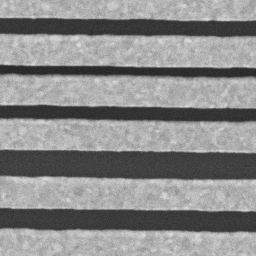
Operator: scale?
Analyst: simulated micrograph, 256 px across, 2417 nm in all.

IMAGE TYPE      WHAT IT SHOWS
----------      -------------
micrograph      lines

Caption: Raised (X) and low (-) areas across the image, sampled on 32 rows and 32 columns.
XXXXXXXXXXXXXXXXXXXXXXXXXXXXXXXX
XXXXXXXXXXXXXXXXXXXXXXXXXXXXXXXX
----------------------XXXX-XXXXX
--------------------------------
XX--XXX---X---------------------
XXXXXXXXXXXXXXXXXXXXXXXXXXXXXXXX
XXXXXXXXXXXXXXXXXXXXXXXXXXXXXXXX
XXXXXXXXXXXXXXXXXXXXXXXXXXXXXXXX
--------------------------------
XX------------------------------
XXXXXXXXXXXXXXXXXXXXXXXXXXXXXXXX
XXXXXXXXXXXXXXXXXXXXXXXXXXXXXXXX
XXXXXXXXXXXXXXXXXXXXXXXXXXXXXXXX
--------------------------------
--------------------------------
XXXXXXXXXXXXXXXXXXXXXXXX-XXXX-XX
XXXXXXXXXXXXXXXXXXXXXXXXXXXXXXXX
XXXXXXXXXXXXXXXXXXXXXXXXXXXXXXXX
XXXXXXXXXXXXXXXXXXXXXXXXXXXXXXXX
--------------------------------
--------------------------------
--------------------------------
XXXXXXXXXXXX--------------------
XXXXXXXXXXXXXXXXXXXXXXXXXXXXXXXX
XXXXXXXXXXXXXXXXXXXXXXXXXXXXXXXX
XXXXXXXXXXXXXXXXXXXXXXXXXXXXXXXX
--------------------------------
--------------------------------
--------------------------------
XXXXXXXXXXXXXXXXXXXXXXXXXXXXXXXX
XXXXXXXXXXXXXXXXXXXXXXXXXXXXXXXX
XXXXXXXXXXXXXXXXXXXXXXXXXXXXXXXX